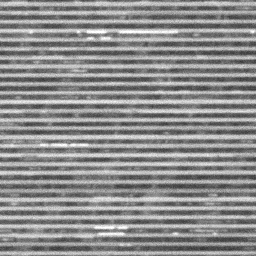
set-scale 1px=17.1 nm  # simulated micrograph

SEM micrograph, parallel lines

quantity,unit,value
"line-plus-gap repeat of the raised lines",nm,152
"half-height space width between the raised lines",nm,114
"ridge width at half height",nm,49.2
